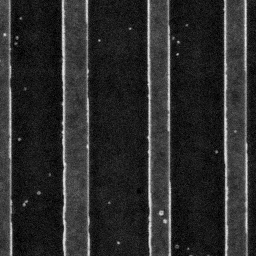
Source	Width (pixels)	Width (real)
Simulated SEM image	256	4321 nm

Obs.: lines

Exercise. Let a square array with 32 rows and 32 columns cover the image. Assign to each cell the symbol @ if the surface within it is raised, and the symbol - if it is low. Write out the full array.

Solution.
@-------@@@--------@@-------@@@-
@-------@@@--------@@-------@@@-
@-------@@@--------@@-------@@@-
@-------@@@--------@@-------@@@-
@-------@@@--------@@-------@@@-
@-------@@@--------@@-------@@@-
@-------@@@--------@@-------@@@-
@-------@@@--------@@-------@@@-
@-------@@@--------@@-------@@@-
@-------@@@--------@@-------@@@-
@-------@@@--------@@-------@@@-
@-------@@@--------@@-------@@@-
@-------@@@--------@@-------@@@-
@-------@@@--------@@-------@@@-
@-------@@@--------@@-------@@@-
@-------@@@--------@@-------@@@-
@-------@@@--------@@-------@@@-
@-------@@@--------@@-------@@@-
@-------@@@--------@@-------@@@-
@-------@@@--------@@-------@@@-
@-------@@@--------@@-------@@@-
@-------@@@--------@@-------@@@-
@-------@@@--------@@-------@@@-
@-------@@@--------@@-------@@@-
@-------@@@--------@@-------@@@-
@-------@@@--------@@-------@@@-
@-------@@@--------@@-------@@@-
@-------@@@--------@@-------@@@-
@-------@@@--------@@-------@@@-
@-------@@@--------@@-------@@@-
@-------@@@--------@@-------@@@-
@-------@@@--------@@-------@@@-